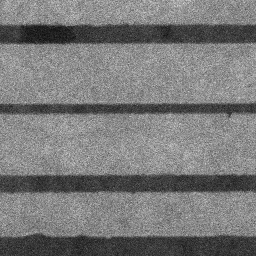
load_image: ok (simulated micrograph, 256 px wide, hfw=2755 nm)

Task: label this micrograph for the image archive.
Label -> one or a few lines or trenches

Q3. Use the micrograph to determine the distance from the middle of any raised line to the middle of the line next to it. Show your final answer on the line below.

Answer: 755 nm